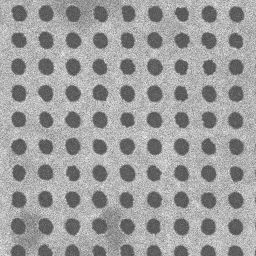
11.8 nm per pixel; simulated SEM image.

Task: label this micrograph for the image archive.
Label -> a regular array of holes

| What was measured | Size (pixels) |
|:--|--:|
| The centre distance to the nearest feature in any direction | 26.4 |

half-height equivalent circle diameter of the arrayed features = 184 nanometres